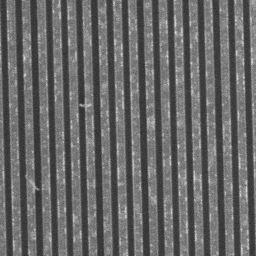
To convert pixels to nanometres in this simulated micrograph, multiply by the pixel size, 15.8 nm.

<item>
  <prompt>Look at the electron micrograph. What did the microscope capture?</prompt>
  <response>parallel lines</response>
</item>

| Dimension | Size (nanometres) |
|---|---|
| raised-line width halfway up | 132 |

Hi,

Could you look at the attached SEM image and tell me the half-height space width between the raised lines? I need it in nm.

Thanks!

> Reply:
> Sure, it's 118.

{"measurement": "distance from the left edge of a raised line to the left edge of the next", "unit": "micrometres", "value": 0.239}